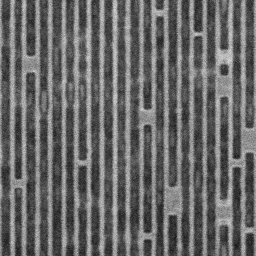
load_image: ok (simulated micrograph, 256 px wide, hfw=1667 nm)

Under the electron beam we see parallel lines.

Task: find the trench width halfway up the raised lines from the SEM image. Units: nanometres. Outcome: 62.6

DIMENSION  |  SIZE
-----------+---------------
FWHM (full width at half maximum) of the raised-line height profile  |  22.8 nanometers